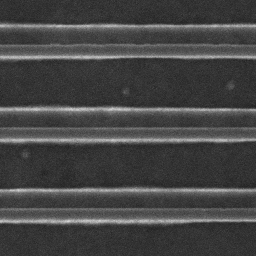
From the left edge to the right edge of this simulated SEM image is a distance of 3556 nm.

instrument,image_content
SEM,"lines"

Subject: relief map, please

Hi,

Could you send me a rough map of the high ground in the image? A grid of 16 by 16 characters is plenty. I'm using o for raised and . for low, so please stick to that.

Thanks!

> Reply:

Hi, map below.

................
................
oooooooooooooooo
oooooooooooooooo
................
................
................
oooooooooooooooo
oooooooooooooooo
................
................
................
oooooooooooooooo
oooooooooooooooo
................
................